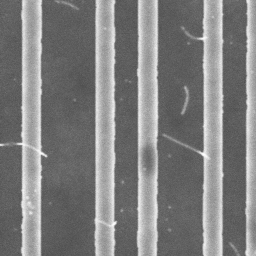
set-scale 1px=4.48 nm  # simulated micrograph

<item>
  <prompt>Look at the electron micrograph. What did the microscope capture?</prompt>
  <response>lines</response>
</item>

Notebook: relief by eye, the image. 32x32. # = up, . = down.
...##.......##...###......##...#
...##.......##...###......##...#
...##.......##...###.....###...#
...##.......##...###......##...#
...##.......##...###.....###...#
...##.......##...###.....###...#
...##.......##...###......##...#
...##.......##...###......##...#
...##.......##...###.....###...#
...##.......##...###......##...#
...##.......##...###......##...#
...##.......##...###......##...#
...##.......##...###......##...#
...##.......##...###......##...#
...##.......##...###......##...#
...##.......##...###......##...#
...##.......##...###......##...#
...##.......##...###......##...#
...##.......##...###......##...#
...##.......##...###.....###...#
...##.......##...###......##...#
...##.......##...###......##...#
...##.......##...###......##...#
...##.......##...###.....###...#
...##.......##...###.....###...#
...##.......##...###.....###...#
...##.......##...###.....###...#
...##.......##...###.....###...#
...##.......##...###.....###...#
...##.......##...###.....###...#
...##.......##...###.....###...#
...##.......##...###.....###...#